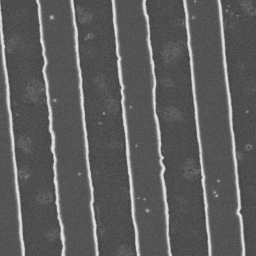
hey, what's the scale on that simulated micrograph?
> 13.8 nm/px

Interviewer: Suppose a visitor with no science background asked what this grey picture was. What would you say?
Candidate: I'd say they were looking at one or a few lines or trenches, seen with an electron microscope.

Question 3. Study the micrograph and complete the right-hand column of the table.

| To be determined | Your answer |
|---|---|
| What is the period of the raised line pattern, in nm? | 1010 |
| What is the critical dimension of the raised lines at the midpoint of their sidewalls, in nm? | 475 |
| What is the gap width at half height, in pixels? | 38.6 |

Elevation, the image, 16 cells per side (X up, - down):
--XXX--XX---XX--
--XXX--XX---XX--
---XX--XX---XX--
---XX--XX---XX--
---XX--XXX--XX--
X--XX---XX--XX--
X--XX---XX--XX--
X--XX---XX--XX--
X--XX---XX--XXX-
X--XX---XX---XX-
X--XXX--XX---XX-
X--XXX--XX---XX-
X---XX--XX---XX-
X---XX--XX---XX-
X---XX--XXX--XX-
X---XX---XX--XX-